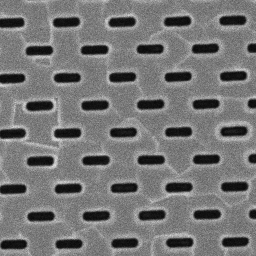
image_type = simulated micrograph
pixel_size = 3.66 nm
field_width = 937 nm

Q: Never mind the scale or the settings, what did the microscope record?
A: a regular array of holes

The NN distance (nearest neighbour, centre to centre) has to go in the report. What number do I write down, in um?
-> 0.142